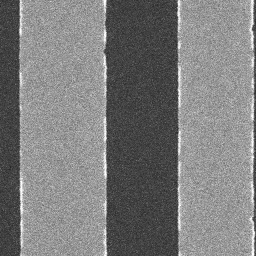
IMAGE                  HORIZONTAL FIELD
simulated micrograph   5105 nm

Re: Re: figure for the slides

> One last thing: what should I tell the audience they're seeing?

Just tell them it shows one or a few lines or trenches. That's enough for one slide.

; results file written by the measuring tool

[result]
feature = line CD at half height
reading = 1600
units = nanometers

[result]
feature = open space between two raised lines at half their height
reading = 1.44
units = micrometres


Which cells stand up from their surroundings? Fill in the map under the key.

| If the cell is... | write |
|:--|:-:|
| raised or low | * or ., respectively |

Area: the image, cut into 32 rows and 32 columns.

...**********.........**********
...**********.........**********
...**********.........**********
..***********.........*********.
..***********.........**********
...**********.........**********
...**********.........**********
...**********.........**********
...**********.........**********
...**********.........**********
...**********.........**********
...**********.........**********
...**********.........**********
...**********.........**********
...**********.........**********
...**********.........**********
...**********.........**********
...**********.........**********
...**********.........**********
...**********.........**********
...**********.........**********
...**********.........**********
...**********.........**********
...**********.........**********
...**********.........**********
...**********.........**********
...**********.........**********
...**********.........**********
...**********.........**********
...**********.........**********
...**********.........**********
...**********.........**********